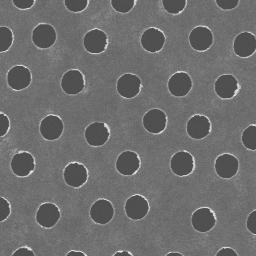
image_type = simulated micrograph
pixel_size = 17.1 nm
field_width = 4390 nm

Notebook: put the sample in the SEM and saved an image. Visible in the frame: a regular array of holes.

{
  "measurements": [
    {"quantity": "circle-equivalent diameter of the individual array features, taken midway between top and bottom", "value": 408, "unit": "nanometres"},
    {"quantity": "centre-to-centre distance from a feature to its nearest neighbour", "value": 0.78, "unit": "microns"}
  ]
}